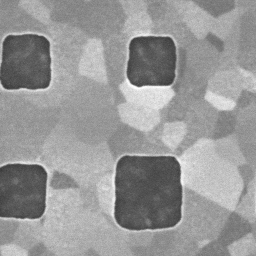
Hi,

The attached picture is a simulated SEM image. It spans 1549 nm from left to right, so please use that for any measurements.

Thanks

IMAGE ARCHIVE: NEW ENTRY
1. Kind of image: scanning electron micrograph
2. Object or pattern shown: holes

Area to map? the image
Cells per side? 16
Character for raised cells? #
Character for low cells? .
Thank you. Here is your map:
################
################
...#####...#####
...#####...#####
...#####...#####
...#############
################
################
################
################
...####....#####
...####....#####
...####....#####
...####....#####
################
################